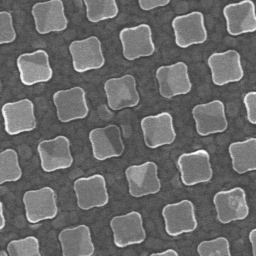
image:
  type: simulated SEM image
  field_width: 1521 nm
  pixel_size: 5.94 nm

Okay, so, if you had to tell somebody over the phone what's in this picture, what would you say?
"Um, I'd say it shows a regular array of raised bodies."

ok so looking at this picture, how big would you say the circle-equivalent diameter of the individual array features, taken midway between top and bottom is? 200 nanometers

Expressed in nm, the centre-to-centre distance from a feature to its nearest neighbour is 309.